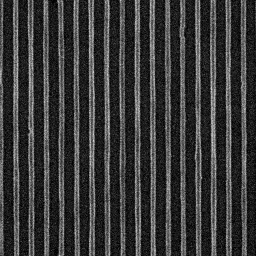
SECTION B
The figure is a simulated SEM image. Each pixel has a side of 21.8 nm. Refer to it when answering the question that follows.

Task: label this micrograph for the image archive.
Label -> parallel lines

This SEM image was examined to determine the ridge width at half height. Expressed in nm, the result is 87.3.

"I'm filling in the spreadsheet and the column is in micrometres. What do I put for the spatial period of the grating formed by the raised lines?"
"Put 0.331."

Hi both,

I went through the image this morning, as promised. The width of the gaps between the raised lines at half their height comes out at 237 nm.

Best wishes